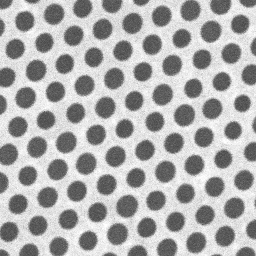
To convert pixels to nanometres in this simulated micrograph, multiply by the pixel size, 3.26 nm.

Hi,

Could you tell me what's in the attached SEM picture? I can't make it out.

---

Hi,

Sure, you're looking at a regular array of holes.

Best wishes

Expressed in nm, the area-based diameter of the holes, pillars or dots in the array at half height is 67.5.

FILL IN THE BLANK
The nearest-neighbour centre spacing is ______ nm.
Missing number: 94.5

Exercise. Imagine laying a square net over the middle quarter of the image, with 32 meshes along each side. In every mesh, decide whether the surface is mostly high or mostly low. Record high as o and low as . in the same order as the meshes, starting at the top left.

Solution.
...ooo...ooooooooo....ooo.....oo
..ooooooooo...ooo.....ooo....ooo
.ooooooooo.....oo.....ooo...oooo
ooo....ooo.....ooo....oooooooooo
ooo.....oo.....oooo.ooooooooooo.
oo......oo....ooooooooo...oooo..
ooo.....oooooooooooooo.....ooo..
ooo....ooooooooo...ooo.....ooo..
ooooooooo...ooo.....oo.....oooo.
oooooooo.....oo.....oo....oooooo
o....ooo.....oo.....oooo.oooo...
o....ooo.....ooo...ooooooooo....
.....ooo....ooooooooo...ooo.....
o....oooo..ooooooooo.....oo.....
o...oooooooooo...ooo.....ooo....
ooooooo...ooo....ooo.....oooo..o
oooooo....ooo....oooo...oooooooo
..ooo......oo....ooooooooo...ooo
...ooo....oooo..ooooooooo.....oo
...ooo....ooooooooo...ooo.....oo
...ooooooooo..oooo.....oo.....oo
..ooooooooo....ooo.....oo....ooo
.ooo...ooo......oo.....oooo.oooo
ooo.....oo......oo....ooooooooo.
ooo.....oo.....ooooooooo...ooo..
.oo.....ooo...ooooooooo.....oo..
.oo.....ooooooooo...ooo.....oo..
.ooo...ooooooooo....ooo.....ooo.
ooooooooo....oo.....ooo....ooooo
oo...ooo.....ooo....oooo..oooooo
o.....oo.....ooo...oooooooooo...
o.....oo.....ooooooooooooooo....